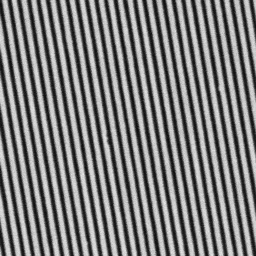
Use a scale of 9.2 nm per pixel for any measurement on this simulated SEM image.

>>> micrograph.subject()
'parallel lines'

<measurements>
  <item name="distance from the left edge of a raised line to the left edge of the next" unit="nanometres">87.6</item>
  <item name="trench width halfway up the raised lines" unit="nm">45.4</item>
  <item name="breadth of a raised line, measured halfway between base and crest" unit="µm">0.0454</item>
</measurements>